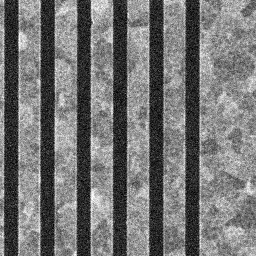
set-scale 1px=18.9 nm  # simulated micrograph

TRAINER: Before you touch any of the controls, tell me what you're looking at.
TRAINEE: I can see parallel lines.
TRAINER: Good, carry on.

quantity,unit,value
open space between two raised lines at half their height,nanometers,295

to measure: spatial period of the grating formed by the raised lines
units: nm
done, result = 686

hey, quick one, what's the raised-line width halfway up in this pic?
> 387 nanometres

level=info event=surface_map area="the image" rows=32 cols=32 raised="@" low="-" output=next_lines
--@@@--@@---@@--@@@--@@--@@@@@@@
--@@@--@@---@@--@@@--@@--@@@@@@@
--@@@--@@---@@--@@@--@@--@@@@@@@
--@@@--@@---@@--@@@--@@--@@@@@@@
--@@@--@@---@@--@@@--@@--@@@@@@@
--@@@--@@---@@--@@---@@--@@@@@@@
--@@@--@@---@@--@@@--@@--@@@@@@@
--@@@--@@---@@--@@@--@@--@@@@@@@
--@@@--@@---@@--@@@--@@--@@@@@@@
--@@@--@@---@@--@@@--@@--@@@@@@@
--@@@--@@---@@--@@@--@@--@@@@@@@
--@@@--@@---@@--@@@--@@--@@@@@@@
--@@@--@@---@@--@@@--@@--@@@@@@@
--@@@--@@--@@@--@@@--@@--@@@@@@@
--@@@--@@--@@@--@@@--@@--@@@@@@@
--@@@--@@--@@@--@@@--@@--@@@@@@@
--@@@--@@--@@@--@@@--@@--@@@@@@@
--@@@--@@--@@@--@@---@@--@@@@@@@
--@@@--@@--@@@--@@---@@--@@@@@@@
--@@@--@@--@@@--@@---@@--@@@@@@@
--@@@--@@--@@@--@@---@@--@@@@@@@
--@@@--@@--@@@--@@---@@--@@@@@@@
--@@@--@@@-@@@--@@---@@--@@@@@@@
--@@@--@@--@@@--@@---@@--@@@@@@@
--@@@--@@--@@@--@@---@@--@@@@@@@
--@@@--@@--@@@--@@---@@--@@@@@@@
--@@@--@@--@@@--@@---@@--@@@@@@@
--@@@--@@--@@@--@@---@@--@@@@@@@
--@@@--@@--@@@--@@---@@--@@@@@@@
--@@@--@@--@@@--@@---@@--@@@@@@@
--@@@--@@--@@@--@@---@@--@@@@@@@
--@@@--@@--@@@--@@---@@--@@@@@@@